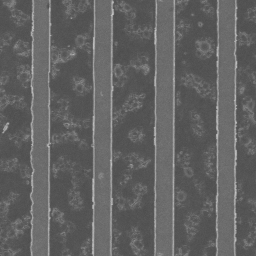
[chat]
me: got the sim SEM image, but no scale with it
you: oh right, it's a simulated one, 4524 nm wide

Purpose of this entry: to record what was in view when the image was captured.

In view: one or a few lines or trenches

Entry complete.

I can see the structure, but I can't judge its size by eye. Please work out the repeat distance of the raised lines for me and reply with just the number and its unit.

1090 nanometres